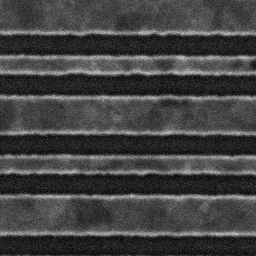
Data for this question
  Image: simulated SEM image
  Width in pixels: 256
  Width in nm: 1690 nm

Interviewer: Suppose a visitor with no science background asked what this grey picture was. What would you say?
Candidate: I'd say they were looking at lines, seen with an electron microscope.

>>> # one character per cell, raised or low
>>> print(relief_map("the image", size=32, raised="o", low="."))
oooooooooooooooooooooooooooooooo
oooooooooooooooooooooooooooooooo
oooooooooooooooooooooooooooooooo
oooooooooooooooooooooooooooooooo
................................
................................
................................
oooooooooooooooooooooooooooooooo
oooooooooooooooooooooooooooooooo
................................
................................
................................
oooooooooooooooooooooooooooooooo
oooooooooooooooooooooooooooooooo
oooooooooooooooooooooooooooooooo
oooooooooooooooooooooooooooooooo
oooooooooooooooooooooooooooooooo
................................
................................
.......oo.......................
oooooooooooooooooooooooooooooooo
oooooooooooooooooooooooooooooooo
................................
................................
..oo............................
oooooooooooooooooooooooooooooooo
oooooooooooooooooooooooooooooooo
oooooooooooooooooooooooooooooooo
oooooooooooooooooooooooooooooooo
................................
................................
................................